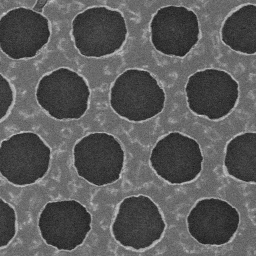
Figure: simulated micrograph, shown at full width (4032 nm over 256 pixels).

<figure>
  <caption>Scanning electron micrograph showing a regular array of holes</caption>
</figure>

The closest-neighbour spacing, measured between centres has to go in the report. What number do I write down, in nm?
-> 1150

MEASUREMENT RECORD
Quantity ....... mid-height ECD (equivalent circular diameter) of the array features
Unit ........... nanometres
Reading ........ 814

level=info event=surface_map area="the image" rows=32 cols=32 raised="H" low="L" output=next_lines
HHHHHHHHHHHHHHHHHHHHHHHHHHHHHHHH
HLLLLHHHHHLLLLLHHHHHLLLLHHHHHLLL
LLLLLLHHHLLLLLLLHHHLLLLLLHHHLLLL
LLLLLLHHHLLLLLLLHHHLLLLLLHHHLLLL
LLLLLLHHHLLLLLLLHHHLLLLLLHHHLLLL
LLLLLLHHHLLLLLLHHHHLLLLLHHHHLLLL
LLLLLHHHHHLLLLHHHHHHLLLHHHHHHHLL
HHHHHHHHHHHHHHHHHHHHHHHHHHHHHHHH
HHHHHHHHHHHHHHHHHHHHHHHHHHHHHHHH
HHHHHHLLLLHHHHHLLLLHHHHHLLLLLHHH
LHHHHLLLLLLHHHLLLLLLHHHLLLLLLLHH
LLHHHLLLLLLHHHLLLLLLLHHLLLLLLLHH
LLHHHLLLLLLHHHLLLLLLLHHLLLLLLLHH
LHHHHLLLLLLHHHLLLLLLHHHHLLLLLHHH
LHHHHHHLLLHHHHHLLLLHHHHHHHLLHHHH
HHHHHHHHHHHHHHHHHHHHHHHHHHHHHHHH
HHHHHHHHHHHHHHHHHHHHHHHHHHHHHHHH
HLLLLHHHHHLLLLHHHHHHLLLLHHHHHLLL
LLLLLLHHHLLLLLLHHHHLLLLLLHHHLLLL
LLLLLLHHHLLLLLLHHHHLLLLLLHHHLLLL
LLLLLLHHHLLLLLLHHHHLLLLLLHHHLLLL
LLLLLLHHHHLLLLLHHHHLLLLLLHHHLLLL
HLLLLHHHHHHLLLLHHHHHHLLLHHHHHHLL
HHHHHHHHHHHHHHHHHHHHHHHHHHHHHHHH
HHHHHHHHHHHHHHHHHLHHHHHHHHHHHHHH
LHHHHHLLLLHHHHHLLLLHHHHHLLLLLHHH
LLHHHLLLLLLHHHHLLLLLHHHHLLLLLLHH
LLHHHLLLLLLHHHLLLLLLHHHLLLLLLLHH
LLHHHLLLLLLHHHLLLLLLLHHHLLLLLLHH
LLHHHLLLLLLHHHLLLLLLHHHHLLLLLHHH
LHHHHHLLLLHHHHHLLLLHHHHHHHLLHHHH
HHHHHHHHHHHHHHHHHHHHHHHHHHHHHHHH